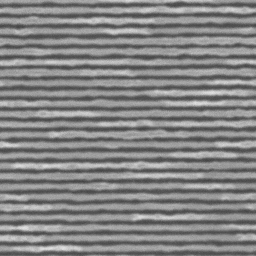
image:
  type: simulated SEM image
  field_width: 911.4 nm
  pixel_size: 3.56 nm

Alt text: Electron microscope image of parallel lines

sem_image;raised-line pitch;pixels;10.4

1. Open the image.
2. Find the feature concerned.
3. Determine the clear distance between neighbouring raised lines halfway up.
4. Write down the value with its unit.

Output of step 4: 0.0174 micrometres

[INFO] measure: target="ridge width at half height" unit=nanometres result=17.4